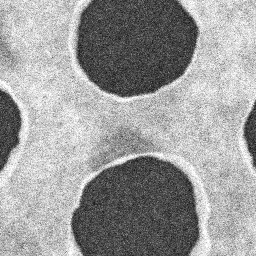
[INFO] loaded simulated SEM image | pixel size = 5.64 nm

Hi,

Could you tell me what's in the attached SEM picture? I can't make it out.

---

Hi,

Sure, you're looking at holes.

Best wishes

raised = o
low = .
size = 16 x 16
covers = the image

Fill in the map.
ooooo.......oooo
ooooo.......oooo
ooooo.......oooo
ooooo.......oooo
ooooo.......oooo
oooooo....oooooo
.ooooooooooooooo
.oooooooooooooo.
.oooooooooooooo.
.ooooooooooooooo
ooooooo.....oooo
ooooo.......oooo
ooooo........ooo
ooooo........ooo
oooo.........ooo
ooooo........ooo